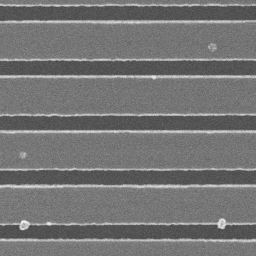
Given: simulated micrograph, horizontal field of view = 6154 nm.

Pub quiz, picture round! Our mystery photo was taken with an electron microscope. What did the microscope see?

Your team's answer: lines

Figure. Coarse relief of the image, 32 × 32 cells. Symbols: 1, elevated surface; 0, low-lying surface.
11111111111111111111111111111111
00000000000000000000000000000000
00000000000000000000000000000000
11111111111111111111111111111111
11111111111111111111111111111111
11111111111111111111111111111111
11111111111111111111111111111111
11111111111111111111111111111111
00000000000000000000000000000000
00100000100000100001000000000000
11111111111111111111111111111111
11111111111111111111111111111111
11111111111111111111111111111111
11111111111111111111111111111111
00000000000000000000000000000000
00000000000000000000000000000000
11111111111111111111111111111111
11111111111111111111111111111111
11111111111111111111111111111111
11111111111111111111111111111111
11111111111111111111111111111111
00000000000000000000000000000000
00000000000000000000000000000000
11111111111111111111111111111111
11111111111111111111111111111111
11111111111111111111111111111111
11111111111111111111111111111111
11111111111111111111111111111111
00000000000000000000000000000000
00000000000000000000000000000000
11111111111111111111111111111111
11111111111111111111111111111111